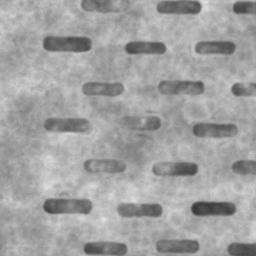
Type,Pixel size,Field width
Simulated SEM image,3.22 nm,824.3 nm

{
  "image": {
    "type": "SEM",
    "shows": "a regular array of holes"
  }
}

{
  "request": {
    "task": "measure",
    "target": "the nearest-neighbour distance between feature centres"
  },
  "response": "168 nanometres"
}